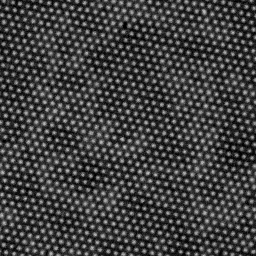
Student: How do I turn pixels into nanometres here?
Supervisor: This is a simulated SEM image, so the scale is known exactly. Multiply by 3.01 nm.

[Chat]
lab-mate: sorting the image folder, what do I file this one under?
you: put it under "a regular array of raised bodies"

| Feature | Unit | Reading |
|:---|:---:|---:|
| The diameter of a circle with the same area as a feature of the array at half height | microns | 0.0123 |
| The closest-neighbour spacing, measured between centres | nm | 22.6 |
